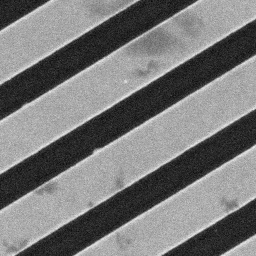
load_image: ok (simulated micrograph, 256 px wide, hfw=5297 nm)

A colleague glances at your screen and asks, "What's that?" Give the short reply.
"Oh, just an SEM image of lines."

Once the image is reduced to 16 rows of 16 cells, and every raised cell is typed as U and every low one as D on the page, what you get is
DDUUUUUUDDDDUUUU
DUUUUUDDDDUUUUUD
UUUUUDDDUUUUUUDD
UUUDDDDUUUUUDDDD
UDDDDUUUUUDDDDUU
DDDUUUUUUDDDDUUU
DDUUUUUDDDDUUUUU
UUUUUUDDDUUUUUUD
UUUUDDDDUUUUUDDD
UUDDDDUUUUUDDDDU
UDDDUUUUUUDDDDUU
DDDUUUUUDDDDUUUU
DUUUUUUDDDUUUUUU
UUUUUDDDDUUUUUDD
UUUDDDDUUUUUDDDD
UUDDDUUUUUUDDDDU